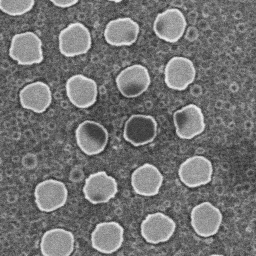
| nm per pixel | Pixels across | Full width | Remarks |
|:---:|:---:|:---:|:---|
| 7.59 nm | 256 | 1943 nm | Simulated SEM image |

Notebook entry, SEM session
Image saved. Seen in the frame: a regular array of raised bodies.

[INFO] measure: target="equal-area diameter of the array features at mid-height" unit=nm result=240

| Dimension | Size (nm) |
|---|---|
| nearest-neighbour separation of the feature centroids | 366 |